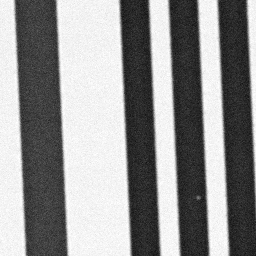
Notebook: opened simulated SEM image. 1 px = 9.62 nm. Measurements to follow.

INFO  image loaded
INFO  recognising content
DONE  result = groups of lines, slits or small figures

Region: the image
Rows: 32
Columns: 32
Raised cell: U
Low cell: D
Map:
UUDDDDDUUUUUUUUDDDDUUDDDDUUDDDDU
UUDDDDDUUUUUUUUDDDDUUDDDDUUDDDDU
UUDDDDDUUUUUUUUDDDDUUDDDDUUDDDDU
UUDDDDDUUUUUUUUDDDDUUDDDDUUDDDDU
UUDDDDDUUUUUUUUDDDDUUDDDDUUDDDDU
UUDDDDDUUUUUUUUDDDDUUDDDDUUDDDDU
UUDDDDDUUUUUUUUDDDDUUDDDDUUDDDDU
UUDDDDDUUUUUUUUDDDDUUDDDDUUDDDDU
UUDDDDDDUUUUUUUDDDDUUDDDDUUDDDDU
UUDDDDDDUUUUUUUDDDDUUDDDDUUDDDDU
UUDDDDDDUUUUUUUDDDDUUDDDDUUUDDDU
UUDDDDDDUUUUUUUDDDDUUUDDDUUUDDDU
UUDDDDDDUUUUUUUDDDDUUUDDDUUUDDDU
UUDDDDDDUUUUUUUDDDDUUUDDDUUUDDDD
UUDDDDDDUUUUUUUUDDDUUUDDDDUUDDDD
UUDDDDDDUUUUUUUUDDDUUUDDDDUUDDDD
UUDDDDDDUUUUUUUUDDDUUUDDDDUUDDDD
UUDDDDDDUUUUUUUUDDDDUUDDDDUUDDDD
UUDDDDDDUUUUUUUUDDDDUUDDDDUUDDDD
UUUDDDDDUUUUUUUUDDDDUUDDDDUUDDDD
UUUDDDDDUUUUUUUUDDDDUUDDDDUUDDDD
UUUDDDDDUUUUUUUUDDDDUUDDDDUUDDDD
UUUDDDDDUUUUUUUUDDDDUUDDDDUUDDDD
UUUDDDDDUUUUUUUUDDDDUUDDDDUUDDDD
UUUDDDDDUUUUUUUUDDDDUUDDDDUUDDDD
UUUDDDDDUUUUUUUUDDDDUUDDDDUUDDDD
UUUDDDDDUUUUUUUUDDDDUUDDDDUUDDDD
UUUDDDDDUUUUUUUUDDDDUUDDDDUUDDDD
UUUDDDDDUUUUUUUUDDDDUUDDDDUUDDDD
UUUDDDDDUUUUUUUUDDDDUUDDDDUUDDDD
UUUDDDDDDUUUUUUUDDDDUUDDDDUUDDDD
UUUDDDDDDUUUUUUUDDDDUUDDDDUUDDDD